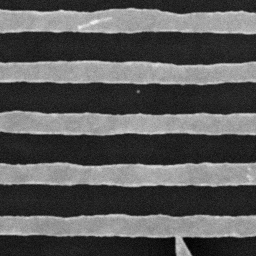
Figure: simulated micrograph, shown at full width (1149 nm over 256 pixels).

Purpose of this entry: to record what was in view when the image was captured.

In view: lines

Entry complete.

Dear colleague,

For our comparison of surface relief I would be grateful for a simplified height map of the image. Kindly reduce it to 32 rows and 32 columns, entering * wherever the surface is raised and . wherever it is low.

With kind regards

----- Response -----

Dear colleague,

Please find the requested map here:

................................
*****.***...*********.........*.
********************************
********************************
................................
................................
................................
................................
********************************
********************************
......................*.**......
................................
................................
................................
********************************
********************************
.*******************************
................................
................................
................................
*...*****..............*********
********************************
********************************
................................
................................
................................
................................
********************************
********************************
.......***.*********************
......................*.........
......................**........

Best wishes